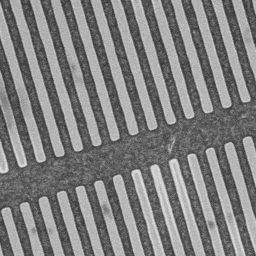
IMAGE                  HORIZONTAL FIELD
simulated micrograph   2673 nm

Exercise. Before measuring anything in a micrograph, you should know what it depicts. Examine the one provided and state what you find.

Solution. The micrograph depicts groups of lines, slits or small figures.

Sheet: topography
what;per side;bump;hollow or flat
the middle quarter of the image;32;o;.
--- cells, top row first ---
.ooo...oo...oo...oo..ooo...oo...
..oo...oo...oo...oo...oo...oo...
..ooo..ooo..oo...oo...ooo..ooo..
..ooo..ooo..ooo...oo..ooo...oo..
...oo...oo...oo...oo...oo...oo..
...oo...oo...oo...oo...oo...oo..
o..oo...ooo..ooo..ooo...oo..ooo.
o..ooo..ooo...oo...oo...oo...oo.
o...oo...oo...oo...oo...oo...oo.
o...oo...ooo..ooo..ooo..oo...ooo
oo..ooo..ooo..ooo..ooo...oo...oo
oo...oo...oo...oo...oo...oo...oo
oo...oo...oo...oo...oo...oo...oo
ooo..oo...oo...ooo...oo..ooo....
.oo...oo...oo...oo...oo...oo....
.oo...oo...oo...oo...oo.........
.oo...oo...oo...oo..............
.ooo..ooo..ooo...o..............
..oo...oo...oo..................
..oo...oo.......................
..ooo.....................o.....
...o............................
................................
...............................o
...........................o...o
...........................o....
......................oo...oo...
.................oo...oo...oo...
............oo...oo....o....o...
........oo..ooo...oo...oo...oo..
........oo...oo...oo...oo...oo..
...oo...oo...oo...oo...oo...oo..